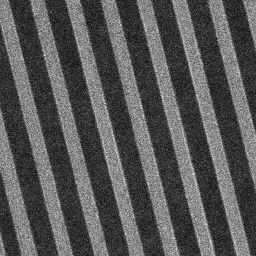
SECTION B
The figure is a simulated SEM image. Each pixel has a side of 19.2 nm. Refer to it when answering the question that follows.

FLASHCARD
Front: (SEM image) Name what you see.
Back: parallel lines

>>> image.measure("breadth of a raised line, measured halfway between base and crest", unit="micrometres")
0.438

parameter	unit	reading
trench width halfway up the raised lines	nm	219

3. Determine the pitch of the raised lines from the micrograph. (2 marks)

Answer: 662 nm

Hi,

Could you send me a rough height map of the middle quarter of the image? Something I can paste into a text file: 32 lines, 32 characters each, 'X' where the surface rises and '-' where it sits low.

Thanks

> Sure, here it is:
XXXXX---XXXXXX---XXXXXX---XXXXX-
XXXXX---XXXXXX---XXXXXX---XXXXXX
XXXXX---XXXXXX---XXXXXX---XXXXXX
XXXXXX---XXXXX---XXXXXX---XXXXXX
XXXXXX---XXXXXX---XXXXXX---XXXXX
XXXXXX---XXXXXX---XXXXXX---XXXXX
-XXXXX---XXXXXX---XXXXXX---XXXXX
-XXXXXX---XXXXX---XXXXXX---XXXXX
-XXXXXX---XXXXXX---XXXXXX---XXXX
-XXXXXX---XXXXXX---XXXXXX---XXXX
-XXXXXX---XXXXXX---XXXXXX---XXXX
--XXXXXX---XXXXX---XXXXXX---XXXX
--XXXXXX---XXXXXX---XXXXXX---XXX
--XXXXXX---XXXXXX---XXXXXX---XXX
--XXXXXX---XXXXXX---XXXXXX---XXX
---XXXXXX---XXXXX---XXXXXX---XXX
---XXXXXX---XXXXXX---XXXXXX---XX
---XXXXXX---XXXXXX---XXXXXX---XX
X--XXXXXX---XXXXXX---XXXXXX---XX
X---XXXXXX---XXXXX---XXXXXX---XX
X---XXXXXX---XXXXXX---XXXXXX---X
X---XXXXXX---XXXXXX---XXXXXX---X
XX--XXXXXX---XXXXXX---XXXXXX---X
XX---XXXXXX---XXXXX---XXXXXX---X
XX---XXXXXX---XXXXXX---XXXXXX---
XX---XXXXXX---XXXXXX---XXXXXX---
XX----XXXXX---XXXXXX---XXXXXX---
XXX---XXXXXX---XXXXX---XXXXXX---
XXX---XXXXXX---XXXXXX---XXXXXX--
XXX---XXXXXX---XXXXXX---XXXXXX--
XXX----XXXXX---XXXXXX---XXXXXX--
XXXX---XXXXXX---XXXXX---XXXXXX--